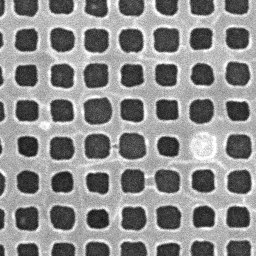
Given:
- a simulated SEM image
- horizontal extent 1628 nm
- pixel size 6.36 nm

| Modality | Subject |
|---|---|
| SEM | a regular array of holes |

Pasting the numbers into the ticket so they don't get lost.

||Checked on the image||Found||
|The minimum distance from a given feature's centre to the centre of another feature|221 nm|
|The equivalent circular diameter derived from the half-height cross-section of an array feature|164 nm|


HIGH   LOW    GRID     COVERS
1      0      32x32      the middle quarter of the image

00111000000111100000111000001111
00011000000111000000111000000111
00011000000111000000111000000111
00011000000111000000111000001111
00011000000111000000111000001111
00111000000111100011111100001111
11111111111111111111111111111111
11111111111111111111111111111111
11111110000111111111111111111111
00111000000011000000111000000111
00111000000011000000111000000110
00011000000011000000111000000110
00011000000011000000111000000110
00011000000011000000111000000110
00111000000111111001111111111111
11111111111111111111111111111111
11111111111111111111111111111111
11111110001111000001111111111111
00111000000111000000111100001111
00111000000011000000011000000111
00111000000000000000011000000111
00011000000010000000011000000111
00011000000011000000011100000111
00111100000111100000111111111111
11111111111111111111111111111111
11111111111111111111111111111111
11111111111111100001111000001111
00111100000111000000111000000111
00111000000111000000000000000111
00011000000111000000000000000111
00011100000111000000000000000111
00111100000111100000111000000111